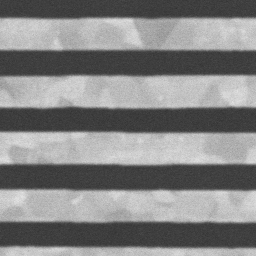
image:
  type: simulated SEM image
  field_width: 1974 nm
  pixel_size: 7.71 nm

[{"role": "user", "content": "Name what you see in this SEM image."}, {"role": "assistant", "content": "lines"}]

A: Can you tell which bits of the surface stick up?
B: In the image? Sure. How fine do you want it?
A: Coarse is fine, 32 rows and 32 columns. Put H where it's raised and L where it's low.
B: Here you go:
LLLLLLLLLLLLLLLLLLLLLLLLLLLLLLLL
LLLLLLLLLLLLLLLLLLLLLLLLLLLLLLLL
HHHHHHHHHHHHHHHHHHHHHHHHHHHHHHHH
HHHHHHHHHHHHHHHHHHHHHHHHHHHHHHHH
HHHHHHHHHHHHHHHHHHHHHHHHHHHHHHHH
HHHHHHHHHHHHHHHHHHHHHHHHHHHHHHHH
LLLLLLLLLLLLLLLLLLLLLLLLLLLLLLLL
LLLLLLLLLLLLLLLLLLLLLLLLLLLLLLLL
LLLLLLLLLLLLLLLLLLLLLLLLLLLLLLLL
LLLLLLLLLLLLLLLLLLLLLLLLLLLLLLLL
HHHHHHHHHHHHHHHHHHHHHHHHHHHHHHHH
HHHHHHHHHHHHHHHHHHHHHHHHHHHHHHHH
HHHHHHHHHHHHHHHHHHHHHHHHHHHHHHHH
LLLLLLLLLLLLLLLLLLLLLLLLLLLLLLLL
LLLLLLLLLLLLLLLLLLLLLLLLLLLLLLLL
LLLLLLLLLLLLLLLLLLLLLLLLLLLLLLLL
LLLLLLLLLLLLLLLLLLLLLLLLLLLLLLLL
HHHHHHHHHHHHHHHHHHHHHHHHHHHHHHHH
HHHHHHHHHHHHHHHHHHHHHHHHHHHHHHHH
HHHHHHHHHHHHHHHHHHHHHHHHHHHHHHHH
LLLLHLLLLLLLLLLHHHHHHHLLLLLLLLLL
LLLLLLLLLLLLLLLLLLLLLLLLLLLLLLLL
LLLLLLLLLLLLLLLLLLLLLLLLLLLLLLLL
LLLLLLLLLLLLLLLLLLLLLLLLLLLLLLLL
HHHHHHHHHHHHHHHHHHHHHHHHHHHHHHHH
HHHHHHHHHHHHHHHHHHHHHHHHHHHHHHHH
HHHHHHHHHHHHHHHHHHHHHHHHHHHHHHHH
HHHHHHHHHHHHHHHHHHHHHHHHHHHHHHHH
LLLLLLLLLLLLLLLLLLLLLLLLLLLLLLLL
LLLLLLLLLLLLLLLLLLLLLLLLLLLLLLLL
LLLLLLLLLLLLLLLLLLLLLLLLLLLLLLLL
HHHHHHHHHHHHHHHHHHHHHHHHHHHHHHHH